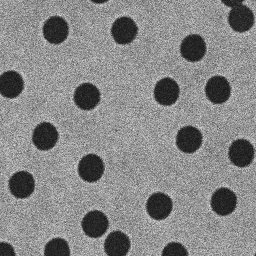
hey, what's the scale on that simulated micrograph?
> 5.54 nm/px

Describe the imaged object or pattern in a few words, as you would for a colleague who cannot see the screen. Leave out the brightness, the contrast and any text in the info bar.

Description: a regular array of holes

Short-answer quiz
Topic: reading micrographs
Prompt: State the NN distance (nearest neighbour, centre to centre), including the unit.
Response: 296 nm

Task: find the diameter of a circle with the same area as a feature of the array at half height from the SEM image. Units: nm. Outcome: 152